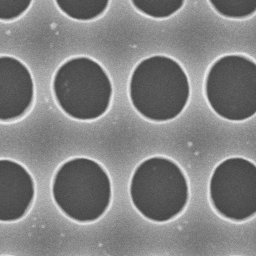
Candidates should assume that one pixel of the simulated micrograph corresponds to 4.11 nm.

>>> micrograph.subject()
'holes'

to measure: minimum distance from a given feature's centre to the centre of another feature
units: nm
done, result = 316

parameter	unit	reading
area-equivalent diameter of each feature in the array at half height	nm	253